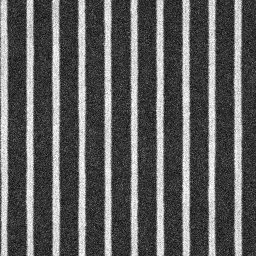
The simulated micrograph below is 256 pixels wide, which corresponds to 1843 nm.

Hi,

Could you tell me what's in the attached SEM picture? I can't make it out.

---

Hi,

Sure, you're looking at parallel lines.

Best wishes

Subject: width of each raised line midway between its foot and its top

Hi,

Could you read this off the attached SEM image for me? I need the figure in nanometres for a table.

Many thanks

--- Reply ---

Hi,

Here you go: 40.5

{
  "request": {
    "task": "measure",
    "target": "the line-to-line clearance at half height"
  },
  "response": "0.143 um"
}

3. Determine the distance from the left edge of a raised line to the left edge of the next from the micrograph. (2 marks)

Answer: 187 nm